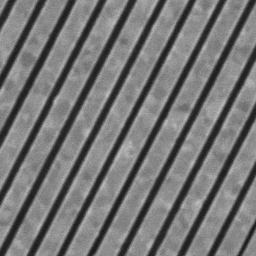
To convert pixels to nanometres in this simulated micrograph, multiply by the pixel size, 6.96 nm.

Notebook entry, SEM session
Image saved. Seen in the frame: parallel lines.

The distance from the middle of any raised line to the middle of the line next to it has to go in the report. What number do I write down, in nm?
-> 186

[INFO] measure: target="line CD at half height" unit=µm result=0.121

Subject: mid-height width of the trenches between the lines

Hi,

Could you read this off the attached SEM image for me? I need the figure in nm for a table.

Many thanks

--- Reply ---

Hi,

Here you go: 61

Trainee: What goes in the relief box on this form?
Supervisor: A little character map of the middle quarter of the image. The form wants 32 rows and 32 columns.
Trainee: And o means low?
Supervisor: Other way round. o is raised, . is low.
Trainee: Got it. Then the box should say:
..ooooo...ooooo..ooooo...ooooo..
..ooooo...oooo...ooooo..ooooo...
.ooooo...ooooo..ooooo...ooooo..o
.ooooo...oooo...ooooo..ooooo...o
ooooo...ooooo..ooooo...ooooo..oo
ooooo..ooooo...ooooo..ooooo...oo
oooo...ooooo..ooooo...ooooo..ooo
oooo..ooooo...ooooo..ooooo...ooo
ooo...ooooo..ooooo...ooooo..oooo
ooo..ooooo...ooooo..ooooo...oooo
oo...ooooo..ooooo...ooooo..ooooo
oo..ooooo...ooooo..ooooo...ooooo
o...ooooo..ooooo...ooooo..ooooo.
o..ooooo...ooooo..ooooo...ooooo.
...ooooo..ooooo...ooooo..ooooo..
..ooooo...oooo...ooooo...ooooo..
..ooooo..ooooo...ooooo..ooooo...
.ooooo...oooo...ooooo...ooooo..o
.ooooo..ooooo...ooooo..ooooo...o
ooooo...oooo...ooooo...ooooo..oo
ooooo..ooooo..oooooo..ooooo...oo
oooo...oooo...ooooo...ooooo..ooo
oooo..ooooo..oooooo..ooooo...ooo
ooo...oooo...ooooo...ooooo..oooo
oo...ooooo...oooo...ooooo...oooo
oo...oooo...ooooo...ooooo..ooooo
o...ooooo..ooooo...ooooo...oooo.
o...oooo...ooooo...ooooo..ooooo.
...ooooo..ooooo...ooooo...oooo..
..ooooo...ooooo..ooooo...ooooo..
..ooooo..ooooo...ooooo...oooo...
.ooooo...ooooo..oooooo..ooooo..o